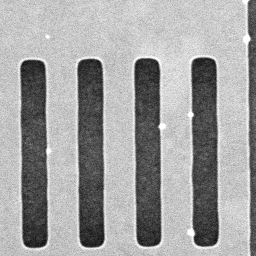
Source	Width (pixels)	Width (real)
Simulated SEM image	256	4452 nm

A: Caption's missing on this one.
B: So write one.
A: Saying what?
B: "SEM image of groups of lines, slits or small figures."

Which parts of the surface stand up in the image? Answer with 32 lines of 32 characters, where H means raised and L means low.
HHHHHHHHHHHHHHHHHHHHHHHHHHHHHHHL
HHHHHHHHHHHHHHHHHHHHHHHHHHHHHHHL
HHHHHHHHHHHHHHHHHHHHHHHHHHHHHHHL
HHHHHHHHHHHHHHHHHHHHHHHHHHHHHHHL
HHHHHHHHHHHHHHHHHHHHHHHHHHHHHHHL
HHHHHHHHHHHHHHHHHHHHHHHHHHHHHHHL
HHHHHHHHHHHHHHHHHHHHHHHHHHHHHHHL
HHHHLHHHHHLLHHHHHLLHHHHHLLLHHHHL
HHHLLLHHHHLLLHHHHLLLHHHHLLLHHHHL
HHLLLLHHHHLLLHHHHLLLHHHHLLLHHHHL
HHHLLLHHHHLLLHHHHLLLHHHHLLLHHHHL
HHHLLLHHHHLLLHHHHLLLHHHHLLLHHHHL
HHHLLLHHHHLLLHHHHLLLHHHHLLLHHHHL
HHHLLLHHHHLLLHHHHLLLHHHHLLLHHHHL
HHHLLLHHHHLLLHHHHLLLHHHHLLLHHHHL
HHHLLLHHHHLLLHHHHLLLHHHHLLLHHHHL
HHHLLLHHHHLLLHHHHLLLHHHHLLLHHHHL
HHHLLLHHHHLLLHHHHLLLHHHHLLLHHHHL
HHHLLLHHHHLLLHHHHLLLHHHHLLLHHHHL
HHHLLLHHHHLLLHHHHLLLHHHHLLLHHHHL
HHHLLLHHHHLLLHHHHLLLHHHHLLLHHHHL
HHHLLLHHHHLLLHHHHLLLHHHHLLLHHHHL
HHHLLLHHHHLLLHHHHLLLHHHHLLLHHHHL
HHHLLLHHHHLLLHHHHLLLHHHHLLLHHHHL
HHHLLLHHHHLLLHHHHLLLHHHHLLLHHHHL
HHHLLLHHHHLLLHHHHLLLHHHHLLLHHHHL
HHHLLLHHHHLLLHHHHLLLHHHHLLLHHHHL
HHHLLLHHHHLLLHHHHLLLHHHHLLLHHHHL
HHHLLLHHHHLLLHHHHLLLHHHHLLLHHHHL
HHHLLLHHHHLLLHHHHLLLHHHHLLLHHHHL
HHHLLLHHHHLLLHHHHLLLHHHHLLLHHHHL
HHHHHHHHHHHHHHHHHHHHHHHHHHHHHHHL